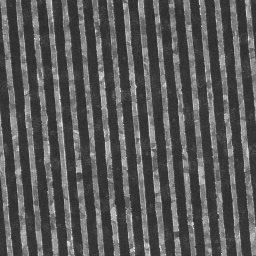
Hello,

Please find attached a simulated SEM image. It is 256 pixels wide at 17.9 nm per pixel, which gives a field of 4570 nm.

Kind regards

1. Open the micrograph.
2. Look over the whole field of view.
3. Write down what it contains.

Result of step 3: parallel lines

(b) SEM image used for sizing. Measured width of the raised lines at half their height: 82.2 nm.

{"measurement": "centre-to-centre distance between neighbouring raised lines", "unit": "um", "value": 0.272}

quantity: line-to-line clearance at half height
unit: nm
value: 187